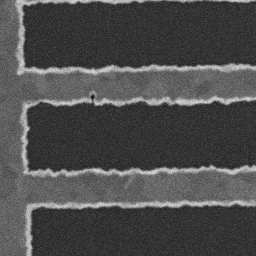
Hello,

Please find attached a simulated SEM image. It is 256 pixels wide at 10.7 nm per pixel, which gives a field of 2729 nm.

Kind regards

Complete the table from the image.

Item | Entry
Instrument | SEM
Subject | one or a few lines or trenches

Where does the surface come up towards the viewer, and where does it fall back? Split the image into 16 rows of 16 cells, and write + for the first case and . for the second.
+...............
+...............
+...............
+...............
++++++++++++++++
++++++++++++++++
++..............
++..............
++..............
++..............
++..............
++++++++++++++++
++++++++++++++++
++..............
++..............
++..............